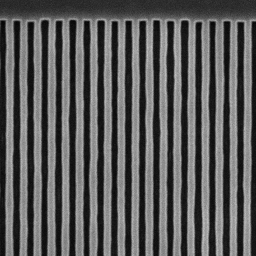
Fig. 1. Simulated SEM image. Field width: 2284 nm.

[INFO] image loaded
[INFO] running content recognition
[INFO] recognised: parallel lines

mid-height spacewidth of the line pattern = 62.4 nanometres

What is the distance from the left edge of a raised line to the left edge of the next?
125 nanometres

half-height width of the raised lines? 0.0624 µm